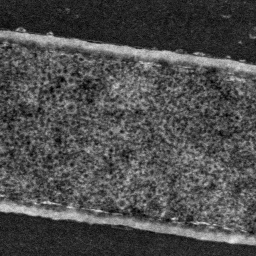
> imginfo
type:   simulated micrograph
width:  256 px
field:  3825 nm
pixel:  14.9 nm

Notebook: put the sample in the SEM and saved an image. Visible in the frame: one or a few lines or trenches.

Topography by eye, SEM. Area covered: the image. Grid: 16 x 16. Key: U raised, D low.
DDDDDDDDDDDDDDDD
DDDDDDDDDDDDDDDD
UUUDDDDDDDDDDDDD
UUUUUUUUUUUDDDDD
UUUUUUUUUUUUUUUU
UUUUUUUUUUUUUUUU
UUUUUUUUUUUUUUUU
UUUUUUUUUUUUUUUU
UUUUUUUUUUUUUUUU
UUUUUUUUUUUUUUUU
UUUUUUUUUUUUUUUU
UUUUUUUUUUUUUUUU
UUUUUUUUUUUUUUUU
DDDDUUUUUUUUUUUU
DDDDDDDDDDDUUUUU
DDDDDDDDDDDDDDDD